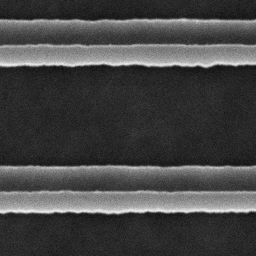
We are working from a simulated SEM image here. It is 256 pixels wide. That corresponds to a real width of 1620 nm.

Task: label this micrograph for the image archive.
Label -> lines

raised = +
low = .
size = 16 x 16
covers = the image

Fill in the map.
................
++++++++++++++++
++++++++++++++++
++++++++++++++++
................
................
................
................
................
................
++++++++++.+++++
++++++++++++++++
++++++++++++++++
................
................
................